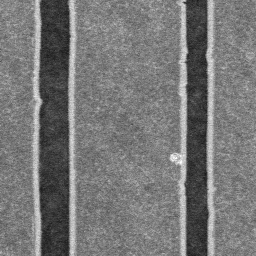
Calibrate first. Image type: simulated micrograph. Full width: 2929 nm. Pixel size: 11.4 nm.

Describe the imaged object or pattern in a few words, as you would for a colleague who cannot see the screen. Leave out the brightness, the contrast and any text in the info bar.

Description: one or a few lines or trenches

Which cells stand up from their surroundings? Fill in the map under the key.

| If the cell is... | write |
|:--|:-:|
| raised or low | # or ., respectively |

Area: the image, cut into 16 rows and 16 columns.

##...######..###
##...######..###
##...######..###
##...######..###
##...######..###
##..#######..###
##...######..###
##...######..###
##...######..###
##...######..###
##...######..###
##...######..###
##...######..###
##...######..###
##...######..###
##...######..###